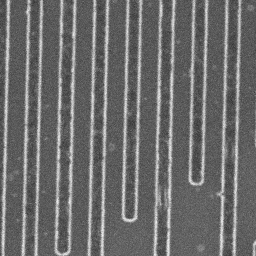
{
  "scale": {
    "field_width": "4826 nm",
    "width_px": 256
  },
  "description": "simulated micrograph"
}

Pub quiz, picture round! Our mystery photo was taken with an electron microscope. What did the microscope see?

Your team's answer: parallel lines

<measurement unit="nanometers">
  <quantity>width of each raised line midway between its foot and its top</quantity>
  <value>247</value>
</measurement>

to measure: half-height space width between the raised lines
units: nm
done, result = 379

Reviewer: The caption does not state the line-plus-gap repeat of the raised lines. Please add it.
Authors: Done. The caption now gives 622 nanometers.